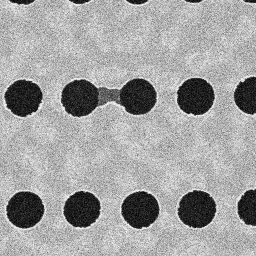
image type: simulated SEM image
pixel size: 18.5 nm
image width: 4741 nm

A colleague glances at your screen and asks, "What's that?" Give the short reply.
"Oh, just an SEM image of a regular array of holes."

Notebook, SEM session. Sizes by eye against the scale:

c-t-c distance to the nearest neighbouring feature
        1.05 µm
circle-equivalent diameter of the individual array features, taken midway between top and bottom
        698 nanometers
